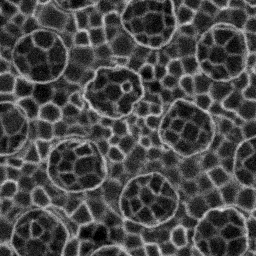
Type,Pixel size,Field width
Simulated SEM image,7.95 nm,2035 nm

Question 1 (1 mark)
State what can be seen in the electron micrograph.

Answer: raised bodies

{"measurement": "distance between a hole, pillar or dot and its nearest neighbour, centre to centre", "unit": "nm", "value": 645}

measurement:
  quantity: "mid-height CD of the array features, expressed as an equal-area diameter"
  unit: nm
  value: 433